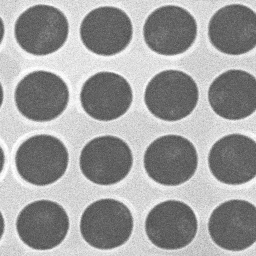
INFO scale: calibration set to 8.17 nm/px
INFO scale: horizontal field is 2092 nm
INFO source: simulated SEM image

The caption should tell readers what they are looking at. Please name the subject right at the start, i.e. a regular array of holes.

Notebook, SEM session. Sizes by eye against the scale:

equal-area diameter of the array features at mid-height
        425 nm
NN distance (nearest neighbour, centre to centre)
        0.523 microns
